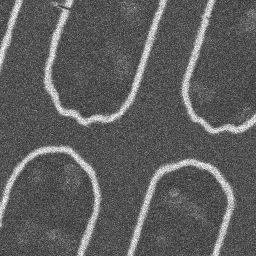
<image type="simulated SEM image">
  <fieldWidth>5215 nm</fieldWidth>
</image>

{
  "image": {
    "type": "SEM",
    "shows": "one or a few lines or trenches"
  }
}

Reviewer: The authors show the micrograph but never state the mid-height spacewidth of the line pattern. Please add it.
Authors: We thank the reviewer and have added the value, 1660 nm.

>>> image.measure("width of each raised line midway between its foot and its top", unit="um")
0.957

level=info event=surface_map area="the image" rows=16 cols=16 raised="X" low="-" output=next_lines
-XXX------XXX---
-XXX------XXX---
XXX------XXX----
XXX------XXX----
XXX------XXX----
XXX-----XXXX----
XXXX----XXXX----
XXXXX-XXXXXX----
XXXXXXXXXXXXXXXX
XXX-XXXXXXXXXXXX
X----XXXXXX--XXX
X-----XXXX----XX
------XXX-----XX
------XXX-----XX
------XXX-----XX
-----XXX------XX